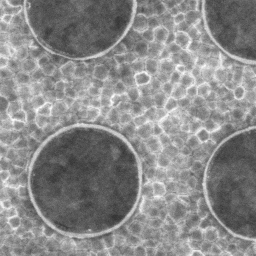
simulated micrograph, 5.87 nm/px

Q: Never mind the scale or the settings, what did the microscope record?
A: raised bodies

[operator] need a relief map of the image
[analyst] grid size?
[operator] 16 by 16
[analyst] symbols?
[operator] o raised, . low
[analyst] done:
..oooooo.....ooo
..oooooo.....ooo
..ooooo......ooo
....oo.........o
................
................
................
................
...oooo.......oo
..oooooo.....ooo
..ooooooo....ooo
..ooooooo....ooo
..ooooooo....ooo
...ooooo.....ooo
....ooo.......oo
................